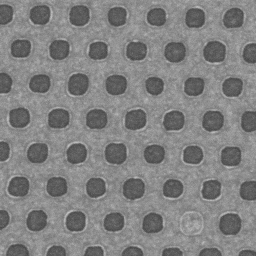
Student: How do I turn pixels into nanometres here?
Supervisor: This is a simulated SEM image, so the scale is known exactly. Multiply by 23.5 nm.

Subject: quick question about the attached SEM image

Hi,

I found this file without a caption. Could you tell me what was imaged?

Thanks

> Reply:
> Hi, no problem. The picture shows a regular array of holes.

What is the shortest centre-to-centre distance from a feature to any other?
903 nanometres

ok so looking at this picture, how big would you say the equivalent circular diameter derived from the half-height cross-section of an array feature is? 524 nm